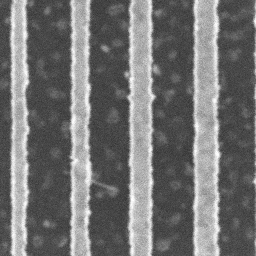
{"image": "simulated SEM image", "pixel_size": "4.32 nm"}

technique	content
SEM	one or a few lines or trenches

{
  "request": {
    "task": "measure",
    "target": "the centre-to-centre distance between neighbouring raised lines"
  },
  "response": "270 nm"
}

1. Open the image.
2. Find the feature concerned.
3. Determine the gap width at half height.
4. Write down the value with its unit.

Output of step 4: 196 nm